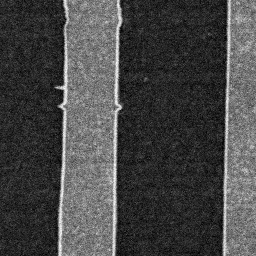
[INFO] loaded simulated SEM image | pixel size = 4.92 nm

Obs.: one or a few lines or trenches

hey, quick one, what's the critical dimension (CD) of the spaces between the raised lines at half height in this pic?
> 544 nm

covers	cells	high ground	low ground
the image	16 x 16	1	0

0000111000000011
0000111000000011
0000111000000011
0000111000000011
0000111000000011
0000111000000011
0000111000000011
0000111000000011
0000111000000011
0000111000000011
0000111000000011
0000111000000011
0000111000000011
0000111000000011
0000111000000011
0000111000000011